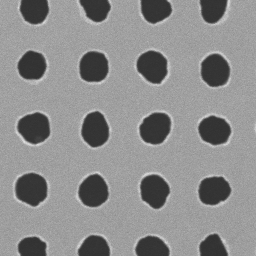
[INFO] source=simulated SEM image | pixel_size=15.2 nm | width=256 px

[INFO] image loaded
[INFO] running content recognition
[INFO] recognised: a regular array of holes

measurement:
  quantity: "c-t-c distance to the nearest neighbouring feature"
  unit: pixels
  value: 59.5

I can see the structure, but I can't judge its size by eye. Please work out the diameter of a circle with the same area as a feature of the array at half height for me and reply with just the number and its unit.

482 nanometers